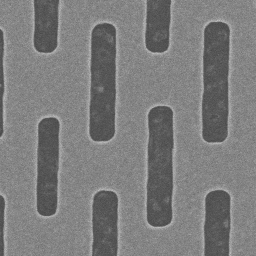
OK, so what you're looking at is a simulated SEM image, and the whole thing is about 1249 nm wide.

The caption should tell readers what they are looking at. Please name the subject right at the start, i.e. holes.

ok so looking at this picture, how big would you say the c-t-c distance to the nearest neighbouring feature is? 0.491 um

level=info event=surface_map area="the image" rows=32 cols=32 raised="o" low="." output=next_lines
oooo...ooooooooooo...ooooooooooo
oooo...ooooooooooo...ooooooooooo
oooo...ooooooooooo...ooooooooooo
oooo...ooooo..oooo...ooooo...ooo
oooo...oooo...oooo...oooo....ooo
oooo...oooo...oooo...oooo....ooo
ooooo.ooooo...ooooo.ooooo....ooo
ooooooooooo....oooooooooo....ooo
ooooooooooo....oooooooooo....ooo
.oooooooooo....oooooooooo....ooo
.oooooooooo....oooooooooo....ooo
.oooooooooo....oooooooooo....ooo
ooooooooooo...ooooooooooo....ooo
ooooooooooo...ooooo..oooo....ooo
ooooooooooo...ooooo...ooo....ooo
ooooo..oooo...ooooo...ooo....ooo
ooooo..oooo...ooooo...ooo...oooo
ooooo..ooooo.oooooo...oooo..oooo
ooooo..ooooooooooo....oooooooooo
ooooo..ooooooooooo....oooooooooo
ooooo..ooooooooooo....oooooooooo
ooooo..ooooooooooo....oooooooooo
ooooo..ooooooooooo....oooooooooo
ooooo..ooooooooooo....oooooooooo
oooo...ooooo...ooo....oooo...ooo
.oooo..ooooo...ooo...ooooo...ooo
.oooo..ooooo...ooo....oooo...ooo
.oooooooooo....ooo...ooooo...ooo
.ooooooooooo...oooooooooo....ooo
oooooooooooo...oooooooooo....ooo
.ooooooooooo...ooooooooooo...ooo
.oooooooooo....oooooooooo....ooo